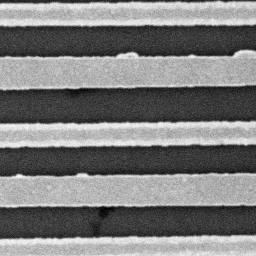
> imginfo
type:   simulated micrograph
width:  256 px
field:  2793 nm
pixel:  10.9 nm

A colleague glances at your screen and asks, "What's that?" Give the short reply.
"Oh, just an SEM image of lines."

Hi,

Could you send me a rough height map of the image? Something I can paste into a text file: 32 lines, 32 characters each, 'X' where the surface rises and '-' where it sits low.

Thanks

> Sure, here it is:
---------------------------X----
XXXXXXXXXXXXXXXXXXXXXXXXXXXXXXXX
XXXXXXXXXXXXXXXXXXXXXXXXXXXXXXXX
--------------------------------
--------------------------------
--------------------------------
------------------------------XX
XXXXXXXXXXXXXXXXXXXXXXXXXXXXXXXX
XXXXXXXXXXXXXXXXXXXXXXXXXXXXXXXX
XXXXXXXXXXXXXXXXXXXXXXXXXXXXXXXX
XXXXXXXXXXXXXXXXXXXXXXXXXXXXXXXX
--------------------------------
--------------------------------
--------------------------------
--------------------------------
--------------------------------
XXXXXXXXXXXXXXXXXXXXXXXXXXXXXXXX
XXXXXXXXXXXXXXXXXXXXXXXXXXXXXXXX
--------------------------------
--------------------------------
--------------------------------
--------------------------------
XXXXXXXXXXXXXXXXXXXXXXXXXXXXXXXX
XXXXXXXXXXXXXXXXXXXXXXXXXXXXXXXX
XXXXXXXXXXXXXXXXXXXXXXXXXXXXXXXX
XXXXXXXXXXXXXXXXXXXXXXXXXXXXXXXX
--------------------------------
--------------------------------
--------------------------------
--------------------------------
XXXXXXXXXXXXXXXXXXXXXXXXXXXXXXXX
XXXXXXXXXXXXXXXXXXXXXXXXXXXXXXXX